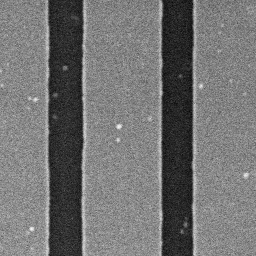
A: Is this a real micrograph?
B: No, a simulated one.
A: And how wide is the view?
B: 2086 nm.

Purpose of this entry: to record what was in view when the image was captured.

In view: lines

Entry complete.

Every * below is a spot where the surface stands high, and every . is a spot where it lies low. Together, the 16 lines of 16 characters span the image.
***..*****..****
***..*****..****
***..*****..****
***..*****..****
***..*****..****
***..*****..****
***..*****..****
***..*****..****
***..*****..****
***..*****..****
***..*****..****
***..*****..****
***..*****..****
***..*****..****
***..*****..****
***..*****..****